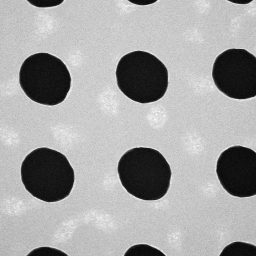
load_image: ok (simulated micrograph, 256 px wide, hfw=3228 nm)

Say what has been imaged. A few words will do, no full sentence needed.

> holes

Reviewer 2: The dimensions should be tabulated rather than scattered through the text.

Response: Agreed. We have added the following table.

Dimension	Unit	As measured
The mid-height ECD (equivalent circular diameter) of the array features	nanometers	669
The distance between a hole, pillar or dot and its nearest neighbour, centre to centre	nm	1210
